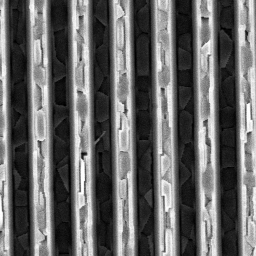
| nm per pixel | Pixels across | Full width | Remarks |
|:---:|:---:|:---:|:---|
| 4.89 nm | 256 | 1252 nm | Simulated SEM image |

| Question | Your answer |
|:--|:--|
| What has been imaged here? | parallel lines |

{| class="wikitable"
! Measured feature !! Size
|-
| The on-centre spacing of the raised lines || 203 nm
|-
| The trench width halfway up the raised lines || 0.107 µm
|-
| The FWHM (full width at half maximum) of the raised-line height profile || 97.2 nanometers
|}